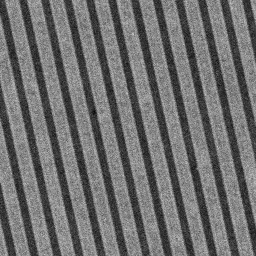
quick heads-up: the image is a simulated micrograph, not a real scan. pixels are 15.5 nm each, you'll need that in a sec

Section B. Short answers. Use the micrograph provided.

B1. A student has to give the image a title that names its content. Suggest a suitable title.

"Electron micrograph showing parallel lines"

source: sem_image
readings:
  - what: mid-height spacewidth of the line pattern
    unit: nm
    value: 159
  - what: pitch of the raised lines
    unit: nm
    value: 338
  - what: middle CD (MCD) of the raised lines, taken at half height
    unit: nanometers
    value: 174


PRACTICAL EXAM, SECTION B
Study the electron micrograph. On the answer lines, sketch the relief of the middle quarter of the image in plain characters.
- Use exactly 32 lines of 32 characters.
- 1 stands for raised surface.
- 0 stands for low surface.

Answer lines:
11100011100011000111000110001110
01100011100011100111000111000110
01110011100011100011000111000111
01110001100011100011100111000111
01110001110011100011100111000111
01110001110001100011100011000111
00110001110001110011100011100011
00111001110001110001100011100011
00111000110001110001110011100011
00111000111000110001110001100011
00011000111000111001110001110001
00011100111000111000110001110001
00011100011000111000111001110001
10011100011100111000111001110001
10011100011100011000111000110001
10001100011100011100111000111000
10001110011100011100011000111000
10001110001100011100011100111000
11001110001110001100011100011000
11000110001110001110011100011100
11000111001110001110001100011100
11000111000110001110001110011100
11100111000111001110001110011100
11100111000111000110001110001100
11100011000111000111001110001110
11100011100111000111000110001110
11100011100011000111000111001110
01110011100011100011000111000110
01110001100011100011100111000111
01110001110011100011100011000111
01110001110011100011100011100111
01110001110001100011100011100111